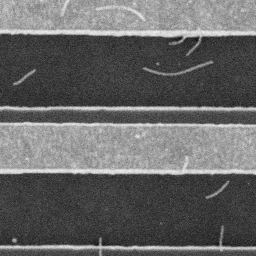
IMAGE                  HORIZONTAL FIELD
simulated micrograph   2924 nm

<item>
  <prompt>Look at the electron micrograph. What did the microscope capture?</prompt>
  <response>lines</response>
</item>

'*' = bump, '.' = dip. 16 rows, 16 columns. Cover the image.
****************
****************
................
................
................
................
................
................
****************
****************
****************
................
................
................
................
................